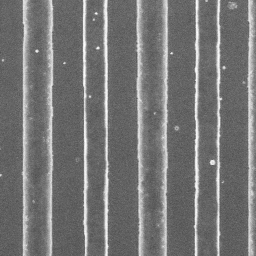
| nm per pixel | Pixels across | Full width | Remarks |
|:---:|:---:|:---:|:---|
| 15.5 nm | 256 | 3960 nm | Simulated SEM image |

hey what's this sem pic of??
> lines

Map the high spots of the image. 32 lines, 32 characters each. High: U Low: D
DDDUUUDDDDDUUDDDDUUUUDDDDUUDDDDU
DDDUUUDDDDDUUDDDDUUUUDDDDUUDDDDU
DDDUUUDDDDUUUDDDDUUUUDDDDUUDDDDU
DDDUUUDDDDUUUDDDDUUUUDDDDUUDDDDU
DDDUUUDDDDUUUDDDDUUUUDDDDUUDDDDU
DDDUUUDDDDDUUDDDDUUUUDDDDUUDDDDU
DDDUUUDDDDUUUDDDDUUUUDDDDUUDDDDU
DDDUUUDDDDUUUDDDDDUUUDDDDUUDDDDU
DDDUUUDDDDDUUDDDDDUUUDDDDUUDDDDU
DDDUUUDDDDDUUDDDDUUUUDDDDUUDDDDU
DDDUUUDDDDDUUDDDDUUUUDDDDUUDDDDU
DDDUUUDDDDDUUDDDDUUUUDDDDUUDDDDU
DDDUUUDDDDDUUDDDDUUUUDDDDUUDDDDU
DDDUUUDDDDDUUDDDDDUUUDDDDUUDDDDU
DDDUUUDDDDDUUDDDDDUUUDDDDUUDDDDU
DDDUUUDDDDDUUDDDDDUUUDDDDUUDDDDU
DDDUUUDDDDDUUDDDDDUUUDDDDUUDDDDU
DDDUUUDDDDDUUDDDDDUUUDDDDUUDDDDU
DDDUUUDDDDDUUDDDDDUUUDDDDUUDDDDU
DDDUUUDDDDDUUDDDDDUUUDDDDUUDDDDU
DDDUUUDDDDDUUDDDDDUUUDDDDUUDDDDU
DDDUUUDDDDDUUDDDDDUUUDDDDUUDDDDU
DDDUUUDDDDDUUDDDDDUUUDDDDUUDDDDU
DDDUUUDDDDDUUDDDDDUUUDDDDUUDDDDU
DDDUUUDDDDDUUDDDDDUUUDDDDUUDDDDU
DDDUUUDDDDDUUDDDDDUUUDDDUUUDDDDU
DDDUUUDDDDDUUDDDDDUUUDDDDUUDDDDU
DDDUUUDDDDDUUDDDDDUUUDDDUUUDDDDU
DDDUUUDDDDDUUDDDDDUUUDDDUUUDDDDU
DDDUUUDDDDDUUDDDDDUUUDDDUUUDDDDU
DDDUUUDDDDDUUDDDDDUUUDDDUUUDDDDU
DDDUUUDDDDDUUDDDDDUUUDDDUUUDDDDU